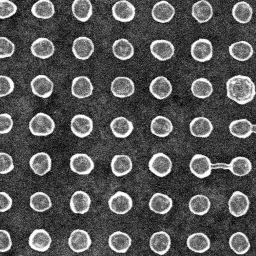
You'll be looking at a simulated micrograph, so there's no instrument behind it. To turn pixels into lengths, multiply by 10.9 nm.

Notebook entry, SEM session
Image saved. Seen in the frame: a regular array of raised bodies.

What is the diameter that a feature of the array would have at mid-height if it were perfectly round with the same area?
225 nanometres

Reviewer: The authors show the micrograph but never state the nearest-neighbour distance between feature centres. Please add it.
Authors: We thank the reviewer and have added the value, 38.2 pixels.